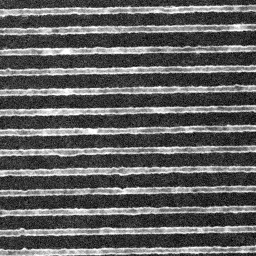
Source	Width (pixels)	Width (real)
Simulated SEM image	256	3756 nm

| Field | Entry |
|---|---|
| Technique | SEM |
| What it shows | parallel lines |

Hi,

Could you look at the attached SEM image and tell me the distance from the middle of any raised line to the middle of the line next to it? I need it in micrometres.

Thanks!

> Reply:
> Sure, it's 0.294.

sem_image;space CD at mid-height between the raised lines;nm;222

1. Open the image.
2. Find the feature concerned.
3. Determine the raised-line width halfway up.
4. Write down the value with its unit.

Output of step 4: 5.13 pixels